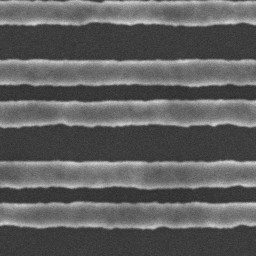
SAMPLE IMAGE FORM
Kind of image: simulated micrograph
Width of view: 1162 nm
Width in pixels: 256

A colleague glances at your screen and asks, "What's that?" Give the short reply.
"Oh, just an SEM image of lines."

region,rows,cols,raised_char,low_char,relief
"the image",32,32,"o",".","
oooooooooooooooooooooooooooooooo
oooooooooooooooooooooooooooooooo
oooooooooooooooooooooooooooooooo
................................
................................
................................
................................
.ooooo.............o..oooooo..oo
oooooooooooooooooooooooooooooooo
oooooooooooooooooooooooooooooooo
oooooooooooooooooooooooooooooooo
................................
................................
oooooooooooooooooooooooooooooooo
oooooooooooooooooooooooooooooooo
ooooooo.ooooooooooo.oooooooo.ooo
................................
................................
................................
................................
oooooooooooooooooooooooooooooooo
oooooooooooooooooooooooooooooooo
oooooooooooooooooooooooooooooooo
..o..............ooooo..o.......
................................
o...ooooooooooooooooo.oooo..oooo
oooooooooooooooooooooooooooooooo
oooooooooooooooooooooooooooooooo
.............o...oo.............
................................
................................
................................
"